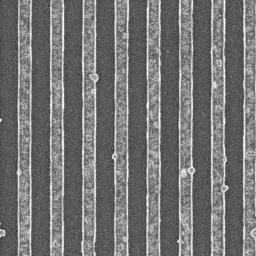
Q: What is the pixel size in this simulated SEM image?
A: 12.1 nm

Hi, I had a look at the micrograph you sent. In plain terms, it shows parallel lines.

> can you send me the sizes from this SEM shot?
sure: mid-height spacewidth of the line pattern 242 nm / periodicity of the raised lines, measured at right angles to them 391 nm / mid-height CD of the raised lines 12.7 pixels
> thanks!